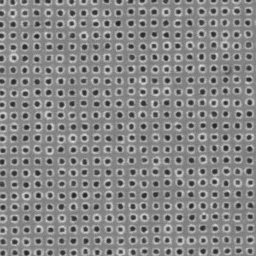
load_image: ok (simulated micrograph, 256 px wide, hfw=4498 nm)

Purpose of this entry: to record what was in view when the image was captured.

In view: a regular array of holes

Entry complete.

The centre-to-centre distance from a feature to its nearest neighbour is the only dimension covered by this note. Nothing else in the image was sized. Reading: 192 nm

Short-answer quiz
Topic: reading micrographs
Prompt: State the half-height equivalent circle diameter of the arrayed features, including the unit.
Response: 112 nanometers